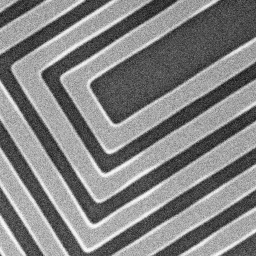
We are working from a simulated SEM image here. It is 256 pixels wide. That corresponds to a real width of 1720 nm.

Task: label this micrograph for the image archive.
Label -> groups of lines, slits or small figures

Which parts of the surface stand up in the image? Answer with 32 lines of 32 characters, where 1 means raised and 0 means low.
11000111110000111100001111000000
00001111000011111000111110000000
00111110001111100001111000000000
11111000011110000111110000000000
11110001111100001111000000000000
11000011110000111110000000000001
00001111000001111000000000000111
00111110000111100000000000011111
00111100001111000000000000111110
00111000111100000000000011111000
00011100111000000000000111110001
10011100111000000000011111000011
10001110011100000000111100001111
11001110001110000011111000111110
11100111001110000111100001111100
11100011100111011111000111110000
01110011100011111100001111100011
00111001110011111000111110001111
00111000111001100001111000011111
10011100111000000111110001111100
10001110011100001111000011111000
11001110001110111100001111100001
11000111001111111000011110000111
11100011000111100001111100011111
01110011100011000011110000111110
00110001110000001111100011111000
00111001110000111110000111100001
00011100111001111000011111000111
10011100011111110000111100001111
11001110001111000011111000111110
11000111001110001111100001111000
11100111000000011111000111110000